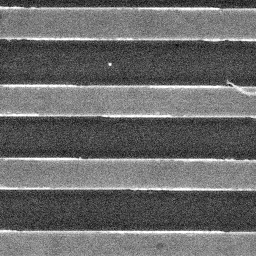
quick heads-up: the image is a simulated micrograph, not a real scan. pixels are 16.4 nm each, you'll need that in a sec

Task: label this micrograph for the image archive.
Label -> lines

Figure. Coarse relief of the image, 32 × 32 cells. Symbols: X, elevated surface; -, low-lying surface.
--------------------------------
XXXXXXXXXXXXXXXXXXXXXXXXXXXXXXXX
XXXXXXXXXXXXXXXXXXXXXXXXXXXXXXXX
XXXXXXXXXXXXXXXXXXXXXXXXXXXXXXXX
XXXXXXXXXXXXXXXXXXXXXXXXXXXXXXXX
--------------------------------
--------------------------------
--------------------------------
--------------------------------
--------------------------------
--------------------------------
XXXXXXXXXXXXXXXXXXXXXXXXXXXXXXXX
XXXXXXXXXXXXXXXXXXXXXXXXXXXXXXXX
XXXXXXXXXXXXXXXXXXXXXXXXXXXXXXXX
----------------X-XXXXXXXXXXXXXX
--------------------------------
--------------------------------
--------------------------------
--------------------------------
--------------------------------
XXXXXXXXXXXXXXXXXXXXXXXXXXXXXXXX
XXXXXXXXXXXXXXXXXXXXXXXXXXXXXXXX
XXXXXXXXXXXXXXXXXXXXXXXXXXXXXXXX
XXXXXXXXXXXXXXXXXXXXXXXXXXXXXXXX
--------------------------------
--------------------------------
--------------------------------
--------------------------------
--------------------------------
XXXXXXXXXXXXXXXXXXXXXXXXXXXXXXXX
XXXXXXXXXXXXXXXXXXXXXXXXXXXXXXXX
XXXXXXXXXXXXXXXXXXXXXXXXXXXXXXXX